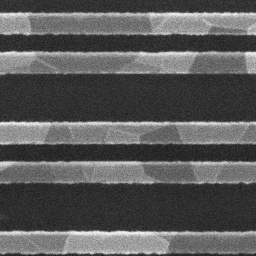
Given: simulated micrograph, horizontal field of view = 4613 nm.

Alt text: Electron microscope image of lines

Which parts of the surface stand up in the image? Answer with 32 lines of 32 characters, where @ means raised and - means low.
--------------------------------
--------------------------------
@@@@@@@@@@@@@@@@@@@@@@@@@@@@@@@@
@@@@@@@@@@@@@@@@@@@@@@@@@@@@@@@@
--------------------------------
--------------------------------
--------------------------------
@@@@@@@@@@@@@@@@@@@@@@@@@@@@@@@@
@@@@@@@@@@@@@@@@@@@@@@@@@@@@@@@@
--------------------------------
--------------------------------
--------------------------------
--------------------------------
--------------------------------
--------------------------------
@@@@@@@@@@@@@@@@@@@@@@@@@@@@@@@@
@@@@@@@@@@@@@@@@@@@@@@@@@@@@@@@@
@@@@@@@@@@@@@@@@@@@@@@@@@@@@@@@@
--------------------------------
--------------------------------
@@@@@@@@@@@@@@@@@@@@@@@@@@@@@@@@
@@@@@@@@@@@@@@@@@@@@@@@@@@@@@@@@
@@@@@@@@@@@@@@@@@@@@@@@@@@@@@@@@
--------------------------------
--------------------------------
--------------------------------
--------------------------------
--------------------------------
--------------------------------
@@@@@@@@@@@@@@@@@@@@@@@@@@@@@@@@
@@@@@@@@@@@@@@@@@@@@@@@@@@@@@@@@
@@@@@@@@@@@@@@@@@@@@@@@@@@@@@@@@